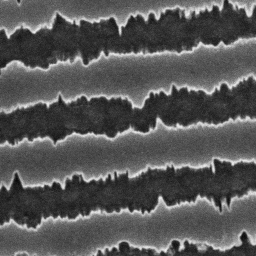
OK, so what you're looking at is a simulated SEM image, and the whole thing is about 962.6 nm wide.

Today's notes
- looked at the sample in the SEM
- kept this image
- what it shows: one or a few lines or trenches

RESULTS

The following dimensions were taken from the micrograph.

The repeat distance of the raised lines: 289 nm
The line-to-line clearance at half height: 0.13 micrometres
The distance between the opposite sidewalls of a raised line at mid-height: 42.2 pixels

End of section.